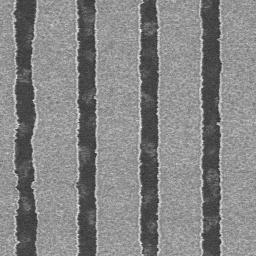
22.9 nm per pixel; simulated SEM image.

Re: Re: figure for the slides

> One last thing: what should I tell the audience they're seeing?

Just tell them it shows one or a few lines or trenches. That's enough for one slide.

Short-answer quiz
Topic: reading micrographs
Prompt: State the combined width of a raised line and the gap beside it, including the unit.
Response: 1.42 microns